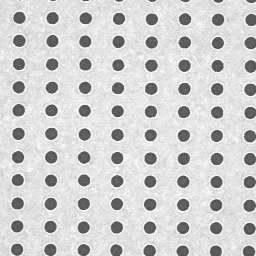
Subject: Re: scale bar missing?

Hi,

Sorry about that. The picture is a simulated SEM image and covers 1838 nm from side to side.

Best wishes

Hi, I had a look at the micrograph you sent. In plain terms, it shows a regular array of holes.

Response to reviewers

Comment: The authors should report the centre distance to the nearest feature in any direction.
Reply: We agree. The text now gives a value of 165 nm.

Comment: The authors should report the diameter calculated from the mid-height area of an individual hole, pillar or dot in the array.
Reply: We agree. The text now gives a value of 90.5 nm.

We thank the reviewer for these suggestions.